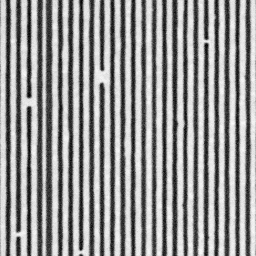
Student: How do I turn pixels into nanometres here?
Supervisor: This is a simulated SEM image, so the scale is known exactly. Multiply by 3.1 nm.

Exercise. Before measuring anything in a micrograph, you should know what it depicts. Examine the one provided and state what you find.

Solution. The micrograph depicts parallel lines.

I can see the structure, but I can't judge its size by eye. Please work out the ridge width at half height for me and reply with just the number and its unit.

17.1 nanometres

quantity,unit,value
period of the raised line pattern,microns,0.0323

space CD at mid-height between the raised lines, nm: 17.1